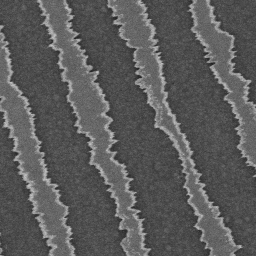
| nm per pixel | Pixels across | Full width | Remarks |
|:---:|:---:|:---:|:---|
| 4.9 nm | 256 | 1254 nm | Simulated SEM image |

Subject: one or a few lines or trenches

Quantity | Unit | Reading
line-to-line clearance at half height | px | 48.5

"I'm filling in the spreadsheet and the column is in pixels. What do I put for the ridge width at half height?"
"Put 22.5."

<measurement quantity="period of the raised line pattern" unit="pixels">72.1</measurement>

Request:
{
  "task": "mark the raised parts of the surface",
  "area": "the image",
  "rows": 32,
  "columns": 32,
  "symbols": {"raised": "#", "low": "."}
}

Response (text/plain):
.....###......####......##......
.....####.....####......###.....
......###......###......###.....
......###......####.....###.....
......####.....####......####...
#......###......###......####...
#......###.......###......###...
#......####......###......###...
#.......###......###.......##...
#.......####.....###.......###..
##.......###.....###........###.
##.......####.....###.......###.
###......####......##.......###.
####.....####......##........###
.###......###......###........##
.###......####......##........##
.###......####.......##.......##
..###......###........#.......##
..###......###........##......##
..###......###........##.......#
..###.......###........#.......#
...###.......###.......##.......
...###.......###.......##.......
....###.......##.......##.......
....###.......###.......##......
....####.......##.......##......
....####.......##........##.....
.....###.......##........###....
.....####......###.......###....
......###.......##.......####...
......###......###........###...
......###.......##........###...